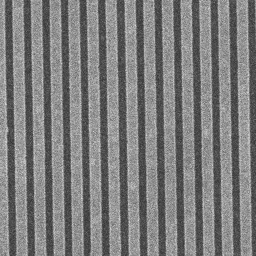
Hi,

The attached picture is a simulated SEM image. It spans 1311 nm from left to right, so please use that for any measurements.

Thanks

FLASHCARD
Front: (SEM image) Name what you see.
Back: parallel lines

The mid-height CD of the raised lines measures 10.3 pixels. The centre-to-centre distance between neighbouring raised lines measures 95.7 nm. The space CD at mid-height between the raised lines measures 42.9 nanometres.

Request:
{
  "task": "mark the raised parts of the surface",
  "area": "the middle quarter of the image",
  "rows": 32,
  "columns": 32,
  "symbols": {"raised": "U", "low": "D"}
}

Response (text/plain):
DDUUDDUUUDDUUDDDUUDDUUUDDUUDDDUU
DDUUDDUUUDDUUDDDUUDDUUUDDUUDDDUU
DDUUDDUUUDDUUDDDUUDDUUUDDUUDDDUU
DDUUDDUUUDDUUDDDUUDDUUUDDUUDDDUU
DDUUDDUUUDDUUDDDUUDDUUUDDUUUDDUU
DDUUDDUUUDDUUDDDUUDDUUUDDUUUDDUU
DDUUDDUUUDDUUDDDUUDDUUUDDUUUDDUU
DDUUDDUUUDDUUDDDUUDDUUUDDUUUDDUU
DDUUDDUUUDDUUDDDUUDDUUUDDUUUDDUU
DDUUDDUUUDDUUDDDUUDDUUUDDUUUDDUU
DDUUDDUUUDDUUDDDUUDDUUUDDUUUDDUU
DDUUDDUUUDDUUDDDUUDDUUUDDUUDDDUU
DDUUDDUUUDDUUDDDUUDDUUUDDUUDDDUU
DDUUDDUUUDDUUDDDUUDDUUUDDUUUDDUU
DDUUDDUUUDDUUDDDUUDDUUUDDUUUDDUU
DDUUDDUUUDDUUDDDUUDDUUUDDUUUDDUU
DDUUDDUUUDDUUDDDUUDDUUUDDUUDDDUU
DDUUDDUUUDDUUDDDUUDDUUUDDUUUDDUU
DDUUDDUUUDDUUUDDUUDDDUUDDUUUDDUU
DDUUDDDUUDDUUUDDUUDDDUUDDUUUDDUU
DDUUDDDUUDDUUUDDUUDDDUUDDUUUDDUU
DDUUDDDUUDDUUUDDUUDDDUUDDUUUDDUU
DDUUDDDUUDDUUUDDUUDDDUUDDUUUDDUU
DDUUDDDUUDDUUUDDUUDDDUUDDUUUDDUU
DDUUDDDUUDDUUUDDUUDDDUUDDUUUDDUU
DDUUDDDUUDDUUUDDUUDDDUUDDUUUDDUU
DDUUDDDUUDDUUUDDUUUDDUUDDUUUDDUU
DDUUDDDUUDDUUUDDUUUDDUUDDUUUDDUU
DDUUUDDUUDDUUUDDUUUDDUUDDUUUDDUU
DDUUUDDUUDDUUUDDUUUDDUUDDUUUDDUU
DDUUDDDUUDDUUUDDUUUDDUUDDUUUDDUU
DDUUDDDUUDDUUUDDUUUDDUUDDUUUDDUU